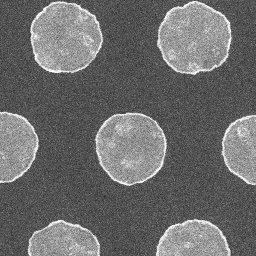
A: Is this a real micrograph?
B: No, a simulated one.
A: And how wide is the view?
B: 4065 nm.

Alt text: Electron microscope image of raised bodies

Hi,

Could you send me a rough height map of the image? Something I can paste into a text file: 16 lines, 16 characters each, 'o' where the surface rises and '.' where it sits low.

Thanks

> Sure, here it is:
...oo......oo...
..oooo....oooo..
..oooo....oooo..
..oooo....oooo..
...o.......oo...
................
................
oo.....ooo.....o
oo....oooo....oo
oo....oooo....oo
oo.....ooo....oo
................
................
................
..oooo....oooo..
..oooo....oooo..